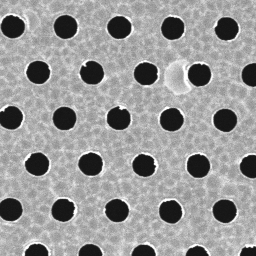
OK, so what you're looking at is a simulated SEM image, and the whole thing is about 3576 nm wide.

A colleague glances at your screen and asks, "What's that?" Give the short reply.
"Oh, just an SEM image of a regular array of holes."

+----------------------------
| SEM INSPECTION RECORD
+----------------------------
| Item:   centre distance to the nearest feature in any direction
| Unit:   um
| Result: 0.734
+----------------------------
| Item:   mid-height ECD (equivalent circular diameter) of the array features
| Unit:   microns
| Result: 0.332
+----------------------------